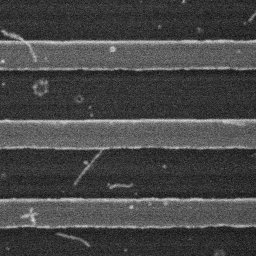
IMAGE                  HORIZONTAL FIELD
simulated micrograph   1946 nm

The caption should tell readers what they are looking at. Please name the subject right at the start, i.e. lines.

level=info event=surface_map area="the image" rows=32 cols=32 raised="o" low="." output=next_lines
................................
................................
................................
................................
................................
oooooooooooooooooooooooooooooooo
oooooooooooooooooooooooooooooooo
oooooooooooooooooooooooooooooooo
oooooooooooooooooooooooooooooooo
................................
................................
................................
................................
................................
................................
oooooooooooooooooooooooooooooooo
oooooooooooooooooooooooooooooooo
oooooooooooooooooooooooooooooooo
......oooooooo...........o......
................................
................................
................................
................................
................................
................................
oooooooooooooooooooooooooooooooo
oooooooooooooooooooooooooooooooo
oooooooooooooooooooooooooooooooo
................................
................................
................................
................................